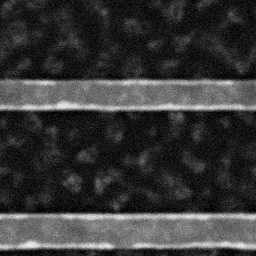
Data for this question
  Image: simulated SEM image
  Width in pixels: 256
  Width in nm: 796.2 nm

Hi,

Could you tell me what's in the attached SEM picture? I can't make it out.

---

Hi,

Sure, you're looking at one or a few lines or trenches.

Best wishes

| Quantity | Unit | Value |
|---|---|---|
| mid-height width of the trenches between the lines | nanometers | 324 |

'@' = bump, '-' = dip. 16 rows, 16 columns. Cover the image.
----------------
----------------
----------------
----------------
----------------
@@@@@@@@@@@@@@@@
@@@@@@@@@@@@@@@@
----------------
----------------
----------------
----------------
----------------
----------------
@@@@@@@@@@@@@@@@
@@@@@@@@@@@@@@@@
@@@--@@@--@----@